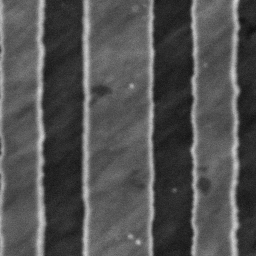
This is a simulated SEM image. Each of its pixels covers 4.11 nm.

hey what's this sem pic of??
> lines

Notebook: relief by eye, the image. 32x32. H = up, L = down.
HHHHHLLLLLLHHHHHHHHLLLLLHHHHHHLL
HHHHHLLLLLLHHHHHHHHLLLLLHHHHHLLL
HHHHHLLLLLLHHHHHHHHLLLLLHHHHHHLL
HHHHHLLLLLLHHHHHHHHLLLLLHHHHHHLL
HHHHHLLLLLLHHHHHHHHLLLLLHHHHHHLL
HHHHHLLLLLLHHHHHHHHLLLLLHHHHHLLL
HHHHHLLLLLLHHHHHHHHLLLLLHHHHHLLL
HHHHHLLLLLLHHHHHHHHLLLLLHHHHHLLL
HHHHHLLLLLLHHHHHHHHLLLLLHHHHHLLL
HHHHHLLLLLLHHHHHHHHLLLLLHHHHHLLL
HHHHHLLLLLLHHHHHHHHLLLLLHHHHHLLL
HHHHHLLLLLLHHHHHHHHLLLLLHHHHHHLL
HHHHHLLLLLLHHHHHHHHLLLLLHHHHHLLL
HHHHHLLLLLLHHHHHHHHLLLLLHHHHHLLL
HHHHHLLLLLLHHHHHHHHLLLLLHHHHHHLL
HHHHHLLLLLLHHHHHHHHLLLLLHHHHHHLL
HHHHHLLLLLLHHHHHHHHLLLLLHHHHHLLL
HHHHHLLLLLLHHHHHHHHLLLLLHHHHHHLL
HHHHHLLLLLLHHHHHHHHLLLLLHHHHHLLL
HHHHHLLLLLLHHHHHHHHLLLLLHHHHHLLL
HHHHHLLLLLLHHHHHHHHLLLLLHHHHHHLL
HHHHHLLLLLLHHHHHHHHLLLLLHHHHHHLL
HHHHHLLLLLLHHHHHHHHLLLLLHHHHHLLL
HHHHHLLLLLLHHHHHHHHLLLLLHHHHHLLL
HHHHHLLLLLLHHHHHHHHLLLLLHHHHHLLL
HHHHHLLLLLLHHHHHHHHLLLLLHHHHHLLL
HHHHHLLLLLLHHHHHHHHLLLLLHHHHHLLL
HHHHHLLLLLLHHHHHHHHLLLLLHHHHHLLL
HHHHHLLLLLLHHHHHHHHLLLLLHHHHHLLL
HHHHHLLLLLLHHHHHHHHLLLLLHHHHHLLL
HHHHHLLLLLLHHHHHHHHLLLLLHHHHHLLL
HHHHHLLLLLLHHHHHHHHLLLLLHHHHHLLL